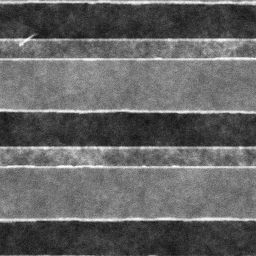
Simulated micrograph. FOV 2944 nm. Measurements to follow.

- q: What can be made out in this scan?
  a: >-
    lines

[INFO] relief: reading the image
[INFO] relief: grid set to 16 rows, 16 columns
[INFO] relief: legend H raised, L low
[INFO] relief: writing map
LLLLLLLLLLLLLLLL
LLLLLLLLLLLLLLLL
LHLHHLHLLLLLLHHH
HHHHHHHHHHHHHHHH
HHHHHHHHHHHHHHHH
HHHHHHHHHHHHHHHH
HHHHHHHHHHHHHHHH
LLLLLLLLLLLLLLLL
LLLLLLLLLLLLLLLL
HHHHHHHHHHHHHHHH
HHHHHHHHHHHHHHHH
HHHHHHHHHHHHHHHH
HHHHHHHHHHHHHHHH
HHHHHHHHHHHHHHHH
LLLLLLLLLLLLLLLL
LLLLLLLLLLLLLLLL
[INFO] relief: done